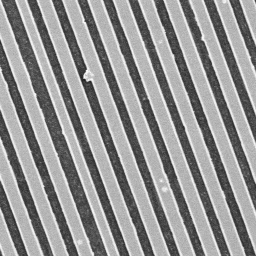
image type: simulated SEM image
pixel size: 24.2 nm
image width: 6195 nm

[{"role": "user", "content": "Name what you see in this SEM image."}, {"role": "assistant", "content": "parallel lines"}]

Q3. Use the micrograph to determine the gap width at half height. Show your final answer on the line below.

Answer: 242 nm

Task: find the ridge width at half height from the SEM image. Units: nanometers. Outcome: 336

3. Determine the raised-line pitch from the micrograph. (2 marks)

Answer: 575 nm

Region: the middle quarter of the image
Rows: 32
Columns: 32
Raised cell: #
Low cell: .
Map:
###...###...####..####...###...#
###...####..####...###...####..#
####.#####...###...####..####...
####.#####...####..####...###...
.###...####..####...###...####..
.####..####...###...####..####..
.####...###...####..####...###..
..###...####..####...###...####.
..####..####...###...####..####.
...###...####..####...###...####
...####..####...###...####..####
#..####...###...####..####...###
#...###...####..####...###...###
#...####..####...###...####..###
##..####...###...####..####...##
##...###...####..####...###...##
##...####..####...###...####..##
###..####...###...####..####...#
###...###...####..####...###...#
.##...####..####...###...####..#
.###...###...####..####...###...
..##...####..####...###...####..
..###..####...###...####..####..
..###...###...####..####...###..
...##...###...####...###...####.
...###..####...###...####..####.
...###...###...####..####...###.
....##...###...####...###...####
....###..####...###...####..####
#...###...###...####..####...###
#....##...####..####...###...###
##...###..####...####..####...##